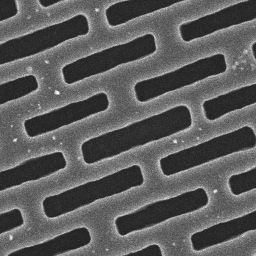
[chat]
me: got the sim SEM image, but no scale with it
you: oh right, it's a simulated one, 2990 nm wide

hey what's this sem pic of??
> holes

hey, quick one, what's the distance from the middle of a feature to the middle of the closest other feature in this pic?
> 71.9 pixels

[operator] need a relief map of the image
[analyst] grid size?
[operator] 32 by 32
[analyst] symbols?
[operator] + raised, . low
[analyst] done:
..+++..+++++++........++++++++..
..+++++++++++......++++++++.....
+++++++++..++...++++++++.......+
++++++.....++++++++++++.....++++
+++.......++++++++.++++...++++++
.......+++++++++...+++++++++++++
.....+++++++.......+++++++++++++
..++++++++.......++++++++...++++
++++++++......+++++++++.....++++
+++.++++...+++++++++......++++++
.....++++++++++++.......++++++++
....+++++++++++++....++++++++...
..+++++++++...+++.++++++++......
++++++++.....+++++++++.+++....++
+++++......++++++++.....++..++++
+++......+++++++........++++++++
+++...++++++++........+++++++...
+++++++++++.........++++++......
++++++++++.......+++++++........
+++++...++....+++++++.......++++
+++.....++++++++++++.....+++++++
.......++++++++...++..+++++++++.
....++++++++......+++++++++++...
.++++++++.......+++++++++++++...
++++++........++++++++....++++++
+++++......++++++++.......++++++
+..+++...++++++++.......++++++++
...++++++++++++......++++++++...
..++++++++.++++...++++++++......
+++++++....+++++++++++++......++
+++++......+++++++++++++...+++++
++......+++++++++...++++++++++++